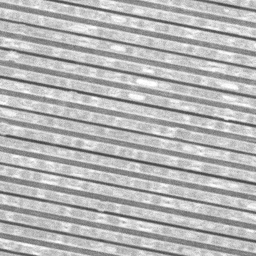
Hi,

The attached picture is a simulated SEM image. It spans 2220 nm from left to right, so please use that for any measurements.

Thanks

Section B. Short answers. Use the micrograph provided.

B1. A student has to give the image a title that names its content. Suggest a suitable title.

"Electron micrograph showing parallel lines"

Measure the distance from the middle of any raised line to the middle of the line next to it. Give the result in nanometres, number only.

122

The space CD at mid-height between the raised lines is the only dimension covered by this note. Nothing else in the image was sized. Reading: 35.1 nm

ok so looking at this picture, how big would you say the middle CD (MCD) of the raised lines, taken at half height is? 85.1 nm